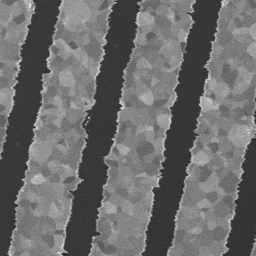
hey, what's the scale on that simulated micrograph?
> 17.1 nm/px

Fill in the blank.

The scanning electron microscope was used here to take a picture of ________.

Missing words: one or a few lines or trenches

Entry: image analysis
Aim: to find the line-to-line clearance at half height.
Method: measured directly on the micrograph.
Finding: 477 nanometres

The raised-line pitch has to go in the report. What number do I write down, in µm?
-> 1.35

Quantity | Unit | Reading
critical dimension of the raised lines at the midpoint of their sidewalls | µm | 0.849